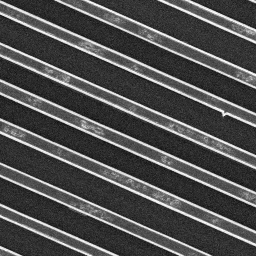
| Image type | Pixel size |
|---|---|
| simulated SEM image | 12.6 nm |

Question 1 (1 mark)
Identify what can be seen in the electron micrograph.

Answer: parallel lines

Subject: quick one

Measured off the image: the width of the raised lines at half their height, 0.149 microns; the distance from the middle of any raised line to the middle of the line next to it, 464 nm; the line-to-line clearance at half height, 299 nm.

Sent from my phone